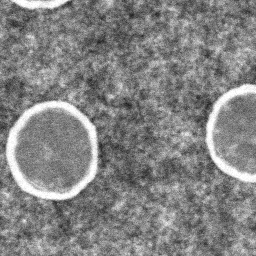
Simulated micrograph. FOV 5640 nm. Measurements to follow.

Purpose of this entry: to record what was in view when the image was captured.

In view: raised bodies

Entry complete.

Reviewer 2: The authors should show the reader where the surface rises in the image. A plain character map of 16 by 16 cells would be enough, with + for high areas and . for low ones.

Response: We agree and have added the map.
................
................
................
................
................
................
...+..........++
.++++........+++
.+++++.......+++
.+++++.......+++
.+++++........++
.++++...........
................
................
................
................